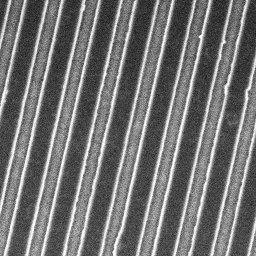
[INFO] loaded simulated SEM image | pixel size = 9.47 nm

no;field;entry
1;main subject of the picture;parallel lines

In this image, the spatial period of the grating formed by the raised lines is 342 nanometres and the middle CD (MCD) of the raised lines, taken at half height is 0.209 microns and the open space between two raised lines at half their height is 126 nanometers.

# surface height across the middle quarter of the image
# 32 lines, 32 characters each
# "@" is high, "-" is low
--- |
@@---@@@@@@---@@@@@@----@@@@@---
@----@@@@@----@@@@@@---@@@@@@---
@----@@@@@----@@@@@----@@@@@@---
@---@@@@@@---@@@@@@----@@@@@@---
@---@@@@@@---@@@@@@----@@@@@----
----@@@@@@---@@@@@@---@@@@@@----
----@@@@@----@@@@@@---@@@@@@---@
---@@@@@@----@@@@@----@@@@@@---@
---@@@@@@---@@@@@@----@@@@@----@
---@@@@@@---@@@@@@----@@@@@----@
---@@@@@----@@@@@@---@@@@@@----@
---@@@@@----@@@@@----@@@@@@---@@
--@@@@@@----@@@@@----@@@@@@---@@
--@@@@@@---@@@@@@----@@@@@----@@
--@@@@@@---@@@@@@---@@@@@@----@@
--@@@@@----@@@@@----@@@@@@---@@@
-@@@@@@----@@@@@----@@@@@@---@@@
-@@@@@@---@@@@@@----@@@@@----@@@
-@@@@@@---@@@@@@----@@@@@----@@@
-@@@@@@---@@@@@@---@@@@@@----@@@
-@@@@@----@@@@@----@@@@@@---@@@@
@@@@@@----@@@@@----@@@@@@---@@@@
@@@@@@---@@@@@@----@@@@@----@@@@
@@@@@----@@@@@@---@@@@@@----@@@@
@@@@@----@@@@@----@@@@@@---@@@@@
@@@@@----@@@@@----@@@@@@---@@@@@
@@@@@---@@@@@@----@@@@@----@@@@@
@@@@@---@@@@@@---@@@@@@----@@@@@
@@@@----@@@@@@---@@@@@@----@@@@@
@@@@----@@@@@----@@@@@@---@@@@@@
@@@@---@@@@@@----@@@@@@---@@@@@@
@@@@---@@@@@@----@@@@@----@@@@@-